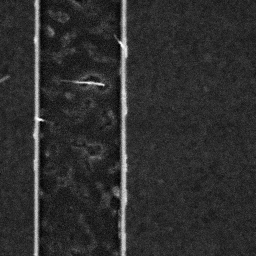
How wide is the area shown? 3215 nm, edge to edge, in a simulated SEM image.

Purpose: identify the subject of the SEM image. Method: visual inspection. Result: one or a few lines or trenches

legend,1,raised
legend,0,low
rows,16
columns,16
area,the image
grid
1100000011111111
1100000011111111
1100000011111111
1100000011111111
1100000011111111
1100000011111111
1100000011111111
1100000011111111
1100000011111111
1100000011111111
1100000011111111
1100000011111111
1100000011111111
1100000011111111
1100000011111111
1100000011111111